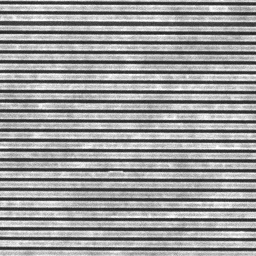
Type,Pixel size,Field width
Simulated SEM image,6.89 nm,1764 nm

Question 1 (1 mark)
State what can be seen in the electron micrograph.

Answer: parallel lines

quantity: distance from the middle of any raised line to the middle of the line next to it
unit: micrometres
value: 0.0677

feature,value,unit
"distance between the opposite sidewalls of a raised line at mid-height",40.5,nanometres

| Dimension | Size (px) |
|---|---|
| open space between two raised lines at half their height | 3.38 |